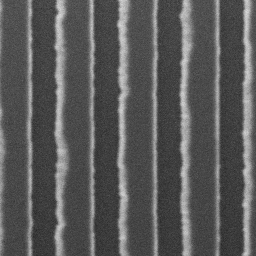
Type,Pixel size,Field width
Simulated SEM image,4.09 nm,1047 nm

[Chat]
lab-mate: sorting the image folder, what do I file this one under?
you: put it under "lines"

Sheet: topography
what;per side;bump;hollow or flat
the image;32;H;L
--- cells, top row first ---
HHHHLLLHHHHHLLLHHHHHLLLHHHHLLLLH
HHHHLLLHHHHHLLLHHHHLLLLHHHHLLLLH
HHHHLLLHHHHHLLLHHHHLLLLHHHHLLLLH
HHHHLLLHHHHHLLLHHHHHLLLHHHHLLLLH
HHHHLLLHHHHHLLLHHHHLLLLHHHHLLLLH
HHHHLLLHHHHHLLLHHHHHLLLHHHHLLLLH
HHHHLLLHHHHHLLLHHHHHLLLHHHHLLLLH
HHHHLLLHHHHHLLLHHHHHLLLHHHHLLLLH
HHHHLLLHHHHHLLLHHHHLLLLHHHHLLLLH
HHHHLLLHHHHHLLLHHHHLLLLHHHHLLLLH
HHHHLLLHHHHHLLLHHHHLLLLHHHHLLLLH
HHHHLLLHHHHHLLLHHHHLLLLHHHHLLLLH
HHHHLLLHHHHHLLLHHHHLLLLHHHHLLLLH
HHHHLLLHHHHHLLLHHHHLLLLHHHHLLLLH
HHHHLLLHHHHHLLLHHHHLLLLHHHHLLLLH
HHHHLLLHHHHHLLLHHHHLLLLHHHHLLLLH
HHHHLLLHHHHHLLLHHHHLLLLHHHHLLLLH
HHHHLLLHHHHHLLLHHHHLLLLHHHHLLLLH
HHHHLLLHHHHHLLLHHHHLLLLHHHHLLLLH
HHHHLLLLHHHHLLLHHHHLLLLHHHHLLLLH
HHHHLLLLHHHHLLLHHHHLLLLHHHHLLLLH
HHHHLLLHHHHHLLLHHHHLLLLHHHHLLLLH
HHHHLLLHHHHHLLLHHHHLLLLHHHHLLLLH
HHHHLLLHHHHHLLLHHHHHLLLHHHHLLLLH
HHHHLLLHHHHHLLLHHHHLLLLHHHHLLLLH
HHHHLLLHHHHHLLLHHHHLLLLHHHHLLLLH
HHHHLLLHHHHHLLLHHHHLLLLHHHHLLLLH
HHHHLLLHHHHHLLLHHHHLLLLHHHHLLLLH
HHHHLLLHHHHHLLLHHHHHLLLHHHHLLLLH
HHHHLLLHHHHHLLLHHHHHLLLHHHHLLLLH
HHHHLLLHHHHHLLLHHHHHLLLHHHHLLLLH
HHHHLLLHHHHHLLLHHHHHLLLHHHHLLLLH